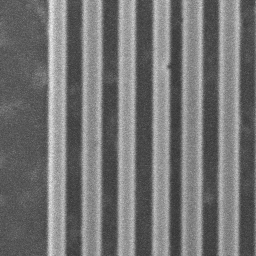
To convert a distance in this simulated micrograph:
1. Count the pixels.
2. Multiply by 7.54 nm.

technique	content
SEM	parallel lines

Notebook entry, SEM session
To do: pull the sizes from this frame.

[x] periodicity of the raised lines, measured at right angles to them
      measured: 259 nanometers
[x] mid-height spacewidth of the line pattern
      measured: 0.136 um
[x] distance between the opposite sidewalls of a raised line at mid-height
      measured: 124 nm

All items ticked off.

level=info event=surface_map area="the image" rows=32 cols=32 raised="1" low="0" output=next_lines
00000011000110011001100110001100
00000011000110011001100110001100
00000011001110011001100110001100
00000011001110011001100110001100
00000011001110011001100110001100
00000011001110011001100110001100
00000011001110011001100110001100
00000011001110011001100110001100
00000011001110011001100110001100
00000011001110011001100110001100
00000011001110011001100110001100
00000011001110011001100110011100
00000011001110011001100110011100
00000011001110011001100110001100
00000011001110011001100110001100
00000011001110011001100110001100
00000011001110011001100110001100
00000011001110011001100110001100
00000011001110011001100110001100
00000011001110011001100110001100
00000011001110011001100110011100
00000011001110011001100110011100
00000011001110011001100110011100
00000011001110011001100110011100
00000011001110011001100110001100
00000011001110011001100110001100
00000011001110011001100110001100
00000011001110011001100110001100
00000011001110011001100110001100
00000011001110011001100110001100
00000011001110011001100110011100
00000011001110011001100110011100